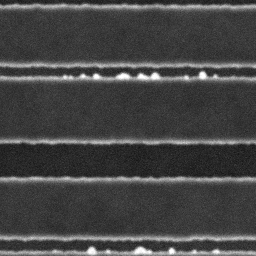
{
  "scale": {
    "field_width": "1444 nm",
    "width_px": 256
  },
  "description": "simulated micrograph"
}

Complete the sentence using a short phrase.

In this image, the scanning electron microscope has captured lines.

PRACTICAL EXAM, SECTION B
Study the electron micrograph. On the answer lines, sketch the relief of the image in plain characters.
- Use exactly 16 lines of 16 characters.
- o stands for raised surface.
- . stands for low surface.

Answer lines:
oooooooooooooooo
oooooooooooooooo
oooooooooooooooo
oooooooooooooooo
oooooooooooooooo
oooooooooooooooo
oooooooooooooooo
oooooooooooooooo
oooooooooooooooo
................
................
oooooooooooooooo
oooooooooooooooo
oooooooooooooooo
oooooooooooooooo
oooooooooooooooo